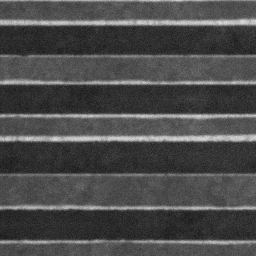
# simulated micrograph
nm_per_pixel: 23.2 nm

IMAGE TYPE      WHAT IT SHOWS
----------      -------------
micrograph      lines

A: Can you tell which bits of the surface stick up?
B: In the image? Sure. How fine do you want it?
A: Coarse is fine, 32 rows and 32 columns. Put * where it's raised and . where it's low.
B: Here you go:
********************************
********************************
********************************
................................
................................
................................
................................
********************************
********************************
********************************
................................
................................
................................
................................
********************************
********************************
********************************
................................
................................
................................
................................
................................
********************************
********************************
********************************
********************************
................................
................................
................................
................................
********************************
********************************